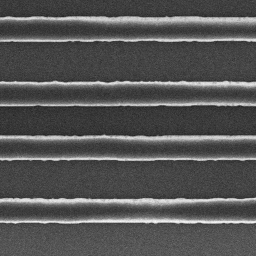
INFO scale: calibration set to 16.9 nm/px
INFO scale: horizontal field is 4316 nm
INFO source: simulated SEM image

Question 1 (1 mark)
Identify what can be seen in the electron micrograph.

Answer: lines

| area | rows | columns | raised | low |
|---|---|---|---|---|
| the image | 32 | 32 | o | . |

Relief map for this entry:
................................
................................
oooooooooooooooooooooooooooooooo
oooooooooooooooooooooooooooooooo
oooooooooooooooooooooooooooooooo
................................
................................
................................
................................
................................
oooooooooooooooooooooooooooooooo
oooooooooooooooooooooooooooooooo
oooooooooooooooooooooooooooooooo
................................
................................
................................
................................
oooooooooooooooooooooooooooooooo
oooooooooooooooooooooooooooooooo
oooooooooooooooooooooooooooooooo
................................
................................
................................
................................
................................
oooooooooooooooooooooooooooooooo
oooooooooooooooooooooooooooooooo
oooooooooooooooooooooooooooooooo
................................
................................
................................
................................